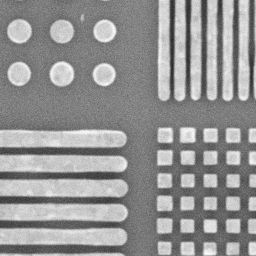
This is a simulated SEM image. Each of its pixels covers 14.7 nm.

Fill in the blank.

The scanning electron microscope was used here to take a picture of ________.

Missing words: groups of lines, slits or small figures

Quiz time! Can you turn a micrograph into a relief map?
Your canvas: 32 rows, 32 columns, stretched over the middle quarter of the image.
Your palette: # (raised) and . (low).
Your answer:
#........##.............##..##..
##......####............##..##..
##......####............##..##..
##......####............##..##..
##......####............##..##..
........................##..##..
........................##..##..
........................##..##..
........................##..##..
................................
................................
................................
................................
................................
................................
................................
........................##.....#
###############.........###...##
###############.........###...##
###############.........##......
##############..................
................................
........................###...##
###############.........###...##
###############.........###...##
###############.................
###############.................
................................
........................###...##
###############.........###...##
################........###.....
################................